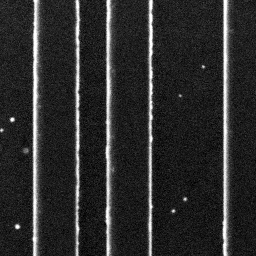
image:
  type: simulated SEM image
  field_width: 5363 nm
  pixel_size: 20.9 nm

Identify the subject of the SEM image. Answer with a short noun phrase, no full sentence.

lines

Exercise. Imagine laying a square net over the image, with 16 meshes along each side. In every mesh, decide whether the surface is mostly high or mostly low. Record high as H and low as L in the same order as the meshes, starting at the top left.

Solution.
LLHHHLLHHLLLLLHH
LLHHHLLHHLLLLLHH
LLHHHLLHHLLLLLHH
LLHHHLLHHLLLLLHH
LLHHHLLHHLLLLLHH
LLHHHLLHHLLLLLHH
LLHHHLLHHLLLLLHH
LLHHHLLHHLLLLLHH
LLHHHLLHHLLLLLHH
LLHHHLLHHLLLLLHH
LLHHHLLHHLLLLLHH
LLHHHLLHHLLLLLHH
LLHHHLLHHLLLLLHH
LLHHHLLHHLLLLLHH
LLHHHLLHHLLLLLHH
LLHHHLLHHLLLLLHH